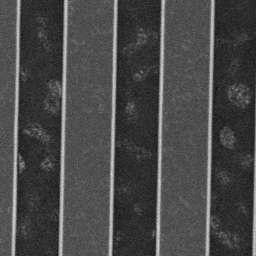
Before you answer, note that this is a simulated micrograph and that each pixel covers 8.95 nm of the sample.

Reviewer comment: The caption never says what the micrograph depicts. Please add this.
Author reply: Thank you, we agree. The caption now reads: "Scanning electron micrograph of one or a few lines or trenches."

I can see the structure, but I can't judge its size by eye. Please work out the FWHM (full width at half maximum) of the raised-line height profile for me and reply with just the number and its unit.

456 nm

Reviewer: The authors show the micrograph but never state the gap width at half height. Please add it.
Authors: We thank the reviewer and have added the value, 414 nm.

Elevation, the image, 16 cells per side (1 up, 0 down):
1000111000111000
1000111000111000
1000111000111000
1000111000111000
1000111000111000
1000111000111000
1000111000111000
1000111000111000
1000111000111000
1000111000111000
1000111000111000
1000111000111000
1000111000111000
1000111000111000
1000111000111000
1000111000111000